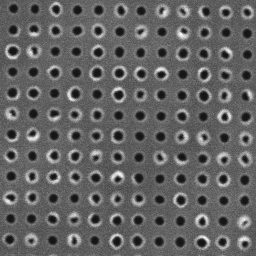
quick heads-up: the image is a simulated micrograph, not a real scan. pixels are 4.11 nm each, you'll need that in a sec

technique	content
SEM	a regular array of holes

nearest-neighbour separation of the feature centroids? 84.1 nm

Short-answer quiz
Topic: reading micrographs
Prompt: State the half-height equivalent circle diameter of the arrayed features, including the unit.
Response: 36.8 nm